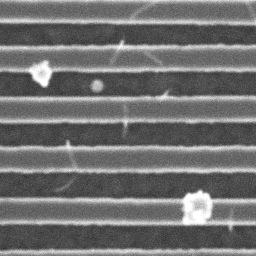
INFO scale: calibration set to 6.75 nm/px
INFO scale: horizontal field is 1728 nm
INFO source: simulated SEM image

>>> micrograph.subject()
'lines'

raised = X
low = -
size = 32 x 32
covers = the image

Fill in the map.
XXXXXXXXXXXXXXXXXXXXXXXXXXXXXXXX
XXXXXXXXXXXXXXXXXXXXXXXXXXXXXXXX
XXXXXXXXXXXXXXXXXXXXXXXXXXXXXXXX
--------------------------------
--------------------------------
--------------------------------
XXXXXXXXXXXXXXXXXXXXXXXXXXXXXXXX
XXXXXXXXXXXXXXXXXXXXXXXXXXXXXXXX
XXXXXXXXXXXXXXXXXXXXXXXXXXXXXXXX
----XX--------------------------
-----X--------------------------
--------------------------------
XXXXXXXXXXXXXXXXXXXXXXXXXXXXXXXX
XXXXXXXXXXXXXXXXXXXXXXXXXXXXXXXX
XXXXXXXXXXXXXXXXXXXXXXXXXXXXXXXX
--------------------------------
--------------------------------
--------------------------------
XXXXXXXXXXXXXXXXXXXXXXXXXXXXXXXX
XXXXXXXXXXXXXXXXXXXXXXXXXXXXXXXX
XXXXXXXXXXXXXXXXXXXXXXXXXXXXXXXX
--XXXX----XXXXX--XXXX---XXX-X--X
--------------------------------
--------------------------------
-----------------------XXX------
XXXXXXXXXXXXXXXXXXXXXXXXXXXXXXXX
XXXXXXXXXXXXXXXXXXXXXXXXXXXXXXXX
XXXXXXXXXXXXXXXXXXXXXXXXXXXXXXXX
--------------------------------
--------------------------------
--------------------------------
XXXXXXXXXXXXXXXXXXXXXXXXXXXXXXXX